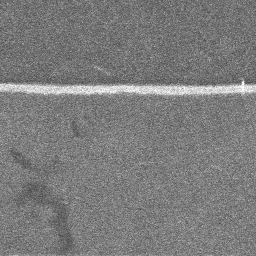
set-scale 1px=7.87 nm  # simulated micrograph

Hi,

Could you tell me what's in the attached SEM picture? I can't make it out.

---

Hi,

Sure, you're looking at one or a few lines or trenches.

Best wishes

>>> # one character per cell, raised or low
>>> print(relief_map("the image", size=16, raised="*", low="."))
................
................
................
................
................
**.....**......*
****************
****************
****************
****************
****************
****************
****************
****************
****************
****************